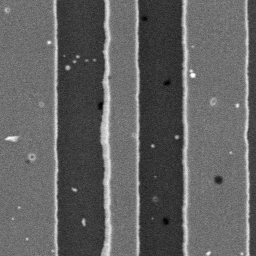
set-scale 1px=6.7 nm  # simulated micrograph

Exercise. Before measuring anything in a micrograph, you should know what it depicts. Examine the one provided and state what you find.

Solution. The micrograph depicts lines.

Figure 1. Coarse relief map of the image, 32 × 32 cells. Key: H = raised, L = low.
HHHHHHHLLLLLLHHHHLLLLLLHHHHHHHHL
HHHHHHHLLLLLLHHHHLLLLLLHHHHHHHHL
HHHHHHHLLLLLLHHHHLLLLLLHHHHHHHHL
HHHHHHHLLLLLLHHHHLLLLLLHHHHHHHHL
HHHHHHHLLLLLLHHHHLLLLLLHHHHHHHHL
HHHHHHHLLLLLLHHHHLLLLLLHHHHHHHHL
HHHHHHHLLLLLLHHHHLLLLLLHHHHHHHHL
HHHHHHHLLLLLLHHHHLLLLLLHHHHHHHHL
HHHHHHHLLLLLLHHHHLLLLLLHHHHHHHHL
HHHHHHHLLLLLLHHHHLLLLLLHHHHHHHHL
HHHHHHHLLLLLLHHHHLLLLLLHHHHHHHHL
HHHHHHHLLLLLLHHHHLLLLLLHHHHHHHHL
HHHHHHHLLLLLLHHHHLLLLLLHHHHHHHHL
HHHHHHHLLLLLLHHHHLLLLLLHHHHHHHHL
HHHHHHHLLLLLLHHHHLLLLLLHHHHHHHHL
HHHHHHHLLLLLLHHHHLLLLLLHHHHHHHHL
HHHHHHHLLLLLLHHHHLLLLLLHHHHHHHHL
HHHHHHHLLLLLLHHHHLLLLLLHHHHHHHHL
HHHHHHHLLLLLLHHHHLLLLLLHHHHHHHHL
HHHHHHHLLLLLLHHHHLLLLLLHHHHHHHHL
HHHHHHHLLLLLLHHHHLLLLLLHHHHHHHHL
HHHHHHHLLLLLLHHHHLLLLLLHHHHHHHHL
HHHHHHHLLLLLLHHHHLLLLLLHHHHHHHHL
HHHHHHHLLLLLLHHHHLLLLLLHHHHHHHHL
HHHHHHHLLLLLLHHHHLLLLLLHHHHHHHHL
HHHHHHHLLLLLLHHHHLLLLLLHHHHHHHHL
HHHHHHHLLLLLLHHHHLLLLLLHHHHHHHHL
HHHHHHHLLLLLLHHHHLLLLLLHHHHHHHHL
HHHHHHHLLLLLLHHHHLLLLLLHHHHHHHHL
HHHHHHHLLLLLLLHHHLLLLLLHHHHHHHHL
HHHHHHHLLLLLLHHHHLLLLLLHHHHHHHHL
HHHHHHHLLLLLLHHHHLLLLLLHHHHHHHHL